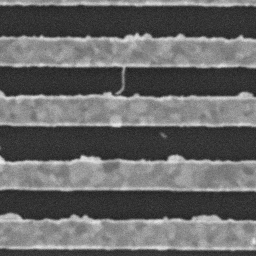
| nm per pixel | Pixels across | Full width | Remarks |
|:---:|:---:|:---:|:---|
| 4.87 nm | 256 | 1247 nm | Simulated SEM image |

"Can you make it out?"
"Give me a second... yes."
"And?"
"lines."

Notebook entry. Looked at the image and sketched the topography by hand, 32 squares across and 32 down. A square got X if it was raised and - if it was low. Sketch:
XXXXXXXXXXXXXXXXXXXXXXXXXXXXXXXX
--------------------------------
--------------------------------
--------------------------------
--------------------------------
XXXXXXXXXXXXXXXXXXXXXXXXXXXXXXXX
XXXXXXXXXXXXXXXXXXXXXXXXXXXXXXXX
XXXXXXXXXXXXXXXXXXXXXXXXXXXXXXXX
--------------------------------
--------------------------------
--------------------------------
--------------------------------
XXXXXXXXXXXXXXXXXXXXXXXXXXXXXXXX
XXXXXXXXXXXXXXXXXXXXXXXXXXXXXXXX
XXXXXXXXXXXXXXXXXXXXXXXXXXXXXXXX
XXXXXXXXXXXXXXXXXXXXXXXXXXXXXXXX
--------------------------------
--------------------------------
--------------------------------
--------------------------------
XXXXXXXXXXXXXXXXXXXXXXXXXXXXXXXX
XXXXXXXXXXXXXXXXXXXXXXXXXXXXXXXX
XXXXXXXXXXXXXXXXXXXXXXXXXXXXXXXX
XXXXXXXXXXXXXXXXXXXXXXXXXXXXXXXX
--------------------------------
--------------------------------
--------------------------------
X----X--XX-----------XX---------
XXXXXXXXXXXXXXXXXXXXXXXXXXXXXXXX
XXXXXXXXXXXXXXXXXXXXXXXXXXXXXXXX
XXXXXXXXXXXXXXXXXXXXXXXXXXXXXXXX
--------------------------------